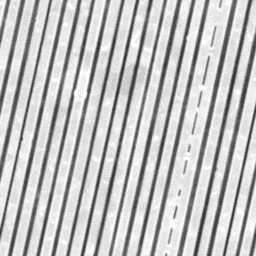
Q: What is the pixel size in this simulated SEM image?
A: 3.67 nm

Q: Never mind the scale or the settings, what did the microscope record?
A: parallel lines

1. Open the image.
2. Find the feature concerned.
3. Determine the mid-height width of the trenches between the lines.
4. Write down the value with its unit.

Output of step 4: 4.66 px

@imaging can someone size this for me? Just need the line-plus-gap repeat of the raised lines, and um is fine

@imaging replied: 0.051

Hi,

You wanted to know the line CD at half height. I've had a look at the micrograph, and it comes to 33.6 nm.